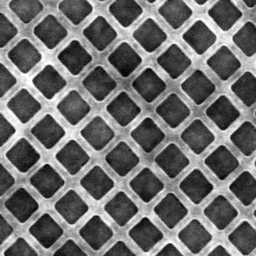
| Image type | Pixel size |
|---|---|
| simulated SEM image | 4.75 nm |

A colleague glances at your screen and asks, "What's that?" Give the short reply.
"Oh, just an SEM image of a regular array of holes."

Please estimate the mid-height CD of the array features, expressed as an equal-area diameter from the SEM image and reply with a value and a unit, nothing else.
146 nanometers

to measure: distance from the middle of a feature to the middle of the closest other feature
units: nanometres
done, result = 165